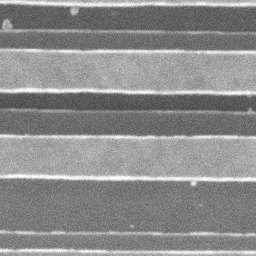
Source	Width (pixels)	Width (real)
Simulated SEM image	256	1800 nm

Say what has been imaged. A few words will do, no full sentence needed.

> lines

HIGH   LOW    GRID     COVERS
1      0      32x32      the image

00000111111111111111111111111111
00000000000000000000000000000000
00000000000000000000000000000000
00000000000000000000000000000000
00000000000000000000000000000000
00000000000000000000000000000000
11111111111111111111111111111111
11111111111111111111111111111111
11111111111111111111111111111111
11111111111111111111111111111111
11111111111111111111111111111111
00000000000000011111111111111111
00000000000000000000000000000000
00000000000000000000000000000000
00000000000000000000000000000000
00000000000000000000000000000000
00000000000000000000000000000000
11111111111111111111111111111111
11111111111111111111111111111111
11111111111111111111111111111111
11111111111111111111111111111111
11111111111111111111111111111111
00000000000000000000000000000111
00000000000000000000000000000000
00000000000000000000000000000000
00000000000000000000000000000000
00000000000000000000000000000000
00000000000000000000000000000000
00000000000000000000000000000000
00000000000000000000000000000000
00000000000000000000000000000000
11111111111111111111111111111111